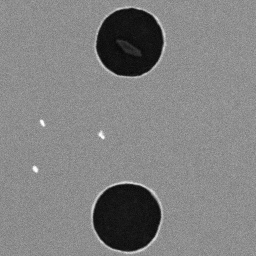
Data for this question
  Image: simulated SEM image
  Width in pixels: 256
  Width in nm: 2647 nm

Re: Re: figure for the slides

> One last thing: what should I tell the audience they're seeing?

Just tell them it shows holes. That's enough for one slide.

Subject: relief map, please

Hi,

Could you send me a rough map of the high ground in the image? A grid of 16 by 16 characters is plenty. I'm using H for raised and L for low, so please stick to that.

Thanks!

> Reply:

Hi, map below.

HHHHHHHHHHHHHHHH
HHHHHHLLLLHHHHHH
HHHHHHLLLLHHHHHH
HHHHHHLLLLHHHHHH
HHHHHHHLLHHHHHHH
HHHHHHHHHHHHHHHH
HHHHHHHHHHHHHHHH
HHHHHHHHHHHHHHHH
HHHHHHHHHHHHHHHH
HHHHHHHHHHHHHHHH
HHHHHHHHHHHHHHHH
HHHHHHHHHHHHHHHH
HHHHHHLLLLHHHHHH
HHHHHHLLLLHHHHHH
HHHHHHLLLLHHHHHH
HHHHHHHLLHHHHHHH